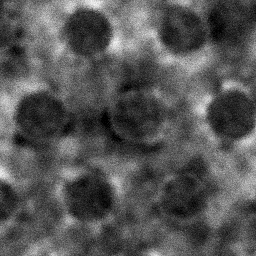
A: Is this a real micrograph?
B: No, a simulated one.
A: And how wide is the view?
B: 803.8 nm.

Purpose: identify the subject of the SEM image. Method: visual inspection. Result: raised bodies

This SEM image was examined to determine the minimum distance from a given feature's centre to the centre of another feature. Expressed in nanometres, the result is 298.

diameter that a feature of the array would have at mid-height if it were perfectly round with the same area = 160 nanometers